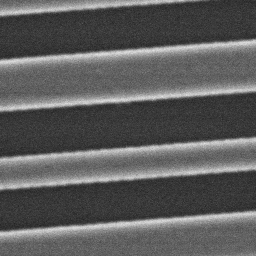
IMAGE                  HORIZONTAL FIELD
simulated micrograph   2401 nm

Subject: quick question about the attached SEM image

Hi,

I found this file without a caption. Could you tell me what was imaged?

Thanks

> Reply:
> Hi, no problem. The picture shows lines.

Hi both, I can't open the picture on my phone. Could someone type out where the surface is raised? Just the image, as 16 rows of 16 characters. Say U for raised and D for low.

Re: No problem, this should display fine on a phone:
UUUUUUDDDDDDDDDD
DDDDDDDDDDDDDDDD
DDDDDDDDDDDDDDDD
DDDDUUUUUUUUUUUU
UUUUUUUUUUUUUUUU
UUUUUUUUUUUUUUUU
UUUUUUDDDDDDDDDD
DDDDDDDDDDDDDDDD
DDDDDDDDDDDDDDDD
DDDDDUUUUUUUUUUU
UUUUUUUUUUUUUUUU
UUUUUDDDDDDDDDDD
DDDDDDDDDDDDDDDD
DDDDDDDDDDDDDUUU
UUUUUUUUUUUUUUUU
UUUUUUUUUUUUUUUU